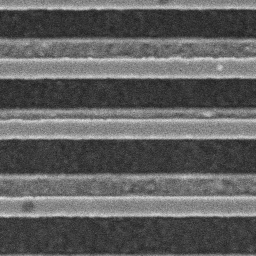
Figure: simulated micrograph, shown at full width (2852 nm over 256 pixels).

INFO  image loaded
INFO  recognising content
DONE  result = lines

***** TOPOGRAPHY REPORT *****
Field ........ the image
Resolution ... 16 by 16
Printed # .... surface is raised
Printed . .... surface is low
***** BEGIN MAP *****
################
................
................
################
################
................
................
################
################
................
................
################
################
###..##.........
................
................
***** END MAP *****